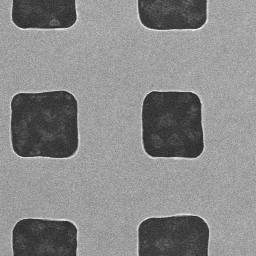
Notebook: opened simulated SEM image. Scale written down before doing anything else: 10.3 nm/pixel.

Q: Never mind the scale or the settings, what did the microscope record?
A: holes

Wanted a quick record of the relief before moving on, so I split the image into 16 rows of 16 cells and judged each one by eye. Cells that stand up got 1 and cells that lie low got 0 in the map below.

1000011110000111
1000111110000111
1111111111111111
1111111111111111
1111111111111111
1111111111111111
1000011110000111
1000011110000111
1000011110000111
1000011110000111
1111111111111111
1111111111111111
1111111111111111
1111111111101111
1000011110000111
1000011110000111